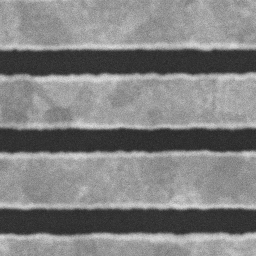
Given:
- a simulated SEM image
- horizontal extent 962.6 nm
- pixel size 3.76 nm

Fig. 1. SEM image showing lines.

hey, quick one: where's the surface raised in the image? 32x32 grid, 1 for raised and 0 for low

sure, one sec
11111111111111111111111111111111
11111111111111111111111111111111
11111111111111111111111111111111
11111111111111111111111111111111
11111111111111111111111111111111
11111111111111111111111111111111
00000000000000000000000000000000
00000000000000000000000000000000
00000000000000000000000000000000
00110000011011011111111111111111
11111111111111111111111111111111
11111111111111111111111111111111
11111111111111111111111111111111
11111111111111111111111111111111
11111111111111111111111111111111
11111111111111111111111111111111
00000000000000000000000000000000
00000000000000000000000000000000
00000000000000000000000000000000
11111111111111111111111111111111
11111111111111111111111111111111
11111111111111111111111111111111
11111111111111111111111111111111
11111111111111111111111111111111
11111111111111111111111111111111
11111111111111111111111111111111
00000000000000000000000000000000
00000000000000000000000000000000
00000000000000000000000000000000
11111110011111111111110111111111
11111111111111111111111111111111
11111111111111111111111111111111